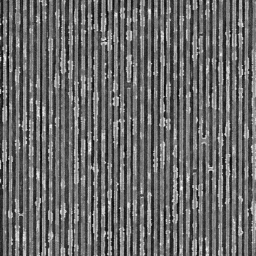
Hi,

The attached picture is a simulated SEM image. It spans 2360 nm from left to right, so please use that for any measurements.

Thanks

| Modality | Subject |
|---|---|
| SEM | parallel lines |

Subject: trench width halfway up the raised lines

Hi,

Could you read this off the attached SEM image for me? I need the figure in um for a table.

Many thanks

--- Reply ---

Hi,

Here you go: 0.0334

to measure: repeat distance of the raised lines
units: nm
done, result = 60.3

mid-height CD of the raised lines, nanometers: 27.7